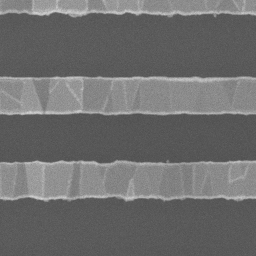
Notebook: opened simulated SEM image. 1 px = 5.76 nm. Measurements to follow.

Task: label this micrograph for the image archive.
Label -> lines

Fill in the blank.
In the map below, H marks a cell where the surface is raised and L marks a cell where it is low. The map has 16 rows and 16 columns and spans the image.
HHHHHHHHHHHHHHHH
LLLLLLLLLLLLLLLL
LLLLLLLLLLLLLLLL
LLLLLLLLLLLLLLLL
LLLLLLLLLLLLLLLL
HHHHHHHHHHHHHHHH
HHHHHHHHHHHHHHHH
LLLLLLLLLLLLLLLL
LLLLLLLLLLLLLLLL
LLLLLLLLLLLLLLLL
HHHHHHHHHHHHHHHH
HHHHHHHHHHHHHHHH
LLLLLLLLLLLLLLLL
LLLLLLLLLLLLLLLL
LLLLLLLLLLLLLLLL
LLLLLLLLLLLLLLLL